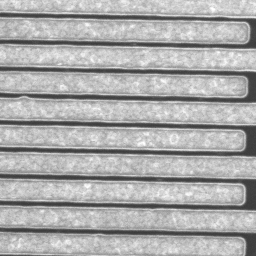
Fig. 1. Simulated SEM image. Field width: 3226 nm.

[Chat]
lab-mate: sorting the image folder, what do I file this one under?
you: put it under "parallel lines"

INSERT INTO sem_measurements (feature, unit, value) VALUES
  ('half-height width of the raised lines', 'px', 6.37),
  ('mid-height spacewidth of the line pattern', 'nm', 250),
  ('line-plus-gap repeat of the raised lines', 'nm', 338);